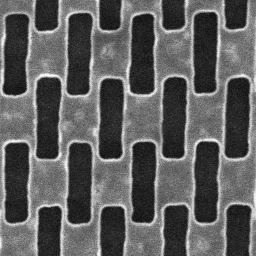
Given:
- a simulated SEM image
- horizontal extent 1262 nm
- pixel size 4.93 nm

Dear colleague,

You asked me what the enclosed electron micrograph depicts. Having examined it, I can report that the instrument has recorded a regular array of holes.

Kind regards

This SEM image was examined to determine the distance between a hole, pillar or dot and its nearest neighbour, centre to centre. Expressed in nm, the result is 311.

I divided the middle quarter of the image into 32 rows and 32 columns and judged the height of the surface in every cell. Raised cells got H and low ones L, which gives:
HLLLLLHHHHHHHHHHHLLLLLLHHHHHHHHH
HLLLLLLHHHHHHHHHLLLLLLLHHHHHHHHH
HLLLLLLHHHHHHHHHLLLLLLLHHHHHHHHH
HLLLLLHHHHHHHHHHLLLLLLLHHHLLLLHH
HLLLLLHHHLLLLLLHLLLLLLLHHLLLLLLH
HLLLLLHHHLLLLLLHLLLLLLLHHLLLLLLH
HLLLLLHHHLLLLLLHLLLLLLLHHLLLLLLH
HLLLLLHHHLLLLLLHHLLLLLHHHLLLLLLH
HHHHHHHHHLLLLLLHHHHHHHHHHLLLLLLH
HHHHHHHHHLLLLLLHHHHHHHHHLLLLLLLH
HHHHHHHHHLLLLLLHHHHHHHHHHLLLLLLH
HHHHHHHHHLLLLLLHHHHHHHHHHLLLLLLH
HHHHHHHHHLLLLLLHHHHHHHHHHLLLLLLH
HHHHHHHHHLLLLLLHHHHHHHHHHLLLLLLH
HHHHHHHHHLLLLLLHHHHHHHHHHLLLLLLH
HHHHHHHHHLLLLLLHHHHHHHHHLLLLLLHH
HHHHHHHHHLLLLLLHHHHHHHHHLLLLLLHH
HHHHHHHHHLLLLLLHHHHHHHHHLLLLLLHH
HHHHHHHHHLLLLLLHHHHHHHHHHLLLLLHH
HHLLLLHHHLLLLLLHHHLLLLHHHLLLLLHH
HLLLLLLHHLLLLLLHHLLLLLLHLLLLLLHH
HLLLLLLHHLLLLLLHHLLLLLLHLLLLLLHH
HLLLLLLHHLLLLLLHHLLLLLLHHLLLLLHH
HLLLLLLHHLLLLLHHHLLLLLLHHLLLLLHH
HLLLLLLHHHHHHHHHHLLLLLLHHHHHHHHH
HLLLLLLHHHHHHHHHHLLLLLLHHHHHHHHH
HLLLLLLHHHHHHHHHHLLLLLLHHHHHHHHH
HLLLLLLHHHHHHHHHHLLLLLLHHHHHHHHH
HLLLLLLHHHHHHHHHHLLLLLLHHHHHHHHH
HLLLLLLHHHHHHHHHHLLLLLLHHHHHHHHH
HLLLLLLHHHHHHHHHHLLLLLLHHHHHHHHH
HLLLLLLHHHHHHHHHHLLLLLLHHHHHHHHH